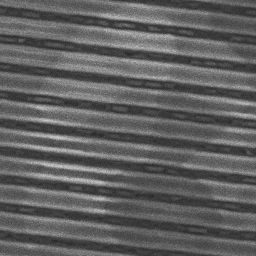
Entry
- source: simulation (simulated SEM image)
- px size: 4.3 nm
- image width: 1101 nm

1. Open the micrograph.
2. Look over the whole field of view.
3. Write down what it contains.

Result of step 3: parallel lines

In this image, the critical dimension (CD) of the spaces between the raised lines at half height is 11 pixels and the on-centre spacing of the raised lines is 120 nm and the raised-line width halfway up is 71.1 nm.